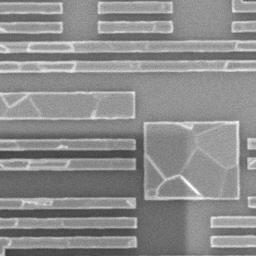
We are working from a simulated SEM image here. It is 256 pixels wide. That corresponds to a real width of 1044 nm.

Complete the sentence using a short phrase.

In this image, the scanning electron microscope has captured wiring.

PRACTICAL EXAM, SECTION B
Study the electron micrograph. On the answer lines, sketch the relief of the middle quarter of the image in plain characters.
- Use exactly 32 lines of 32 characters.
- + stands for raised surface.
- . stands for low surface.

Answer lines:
++++++++++++++++++++++++++++++++
++++++++++++++++++++++++++++++++
................................
................................
................................
................................
................................
++++++++++++++++++..............
++++++++++++++++++..............
++++++++++++++++++..............
++++++++++++++++++..............
++++++++++++++++++..............
++++++++++++++++++..............
+++++++++.+++...................
................................
....................++++++++++++
....................++++++++++++
....................++++++++++++
....................++++++++++++
++++++++++++++++++..++++++++++++
++++++++++++++++++..++++++++++++
....................++++++++++++
....................++++++++++++
....................++++++++++++
++++++++++++++++++..++++++++++++
++++++++++++++++++..++++++++++++
....................++++++++++++
....................++++++++++++
....................++++++++++++
....................++++++++++++
....................++++++++++++
....................++++++++++++